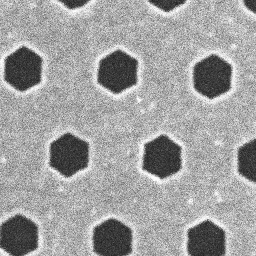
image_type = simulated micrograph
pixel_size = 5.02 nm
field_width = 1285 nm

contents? holes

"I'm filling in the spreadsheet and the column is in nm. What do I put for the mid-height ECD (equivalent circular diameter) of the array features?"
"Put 210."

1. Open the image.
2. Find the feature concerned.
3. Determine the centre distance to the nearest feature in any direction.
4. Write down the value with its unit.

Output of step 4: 94.6 px